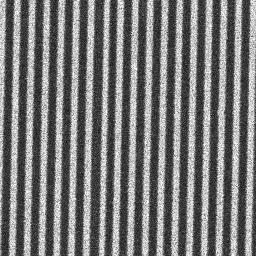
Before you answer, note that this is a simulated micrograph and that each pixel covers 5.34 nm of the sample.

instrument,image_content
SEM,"parallel lines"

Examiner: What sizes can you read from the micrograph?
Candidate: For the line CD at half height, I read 0.0327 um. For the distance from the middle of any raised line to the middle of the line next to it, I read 0.0788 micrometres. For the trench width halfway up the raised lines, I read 46.7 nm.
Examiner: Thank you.